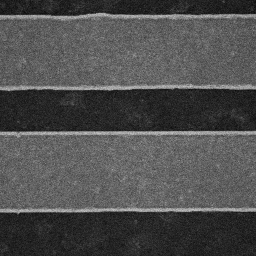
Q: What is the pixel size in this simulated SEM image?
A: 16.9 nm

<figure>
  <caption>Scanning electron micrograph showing one or a few lines or trenches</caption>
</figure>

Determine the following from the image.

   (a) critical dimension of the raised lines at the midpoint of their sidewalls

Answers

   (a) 1.27 microns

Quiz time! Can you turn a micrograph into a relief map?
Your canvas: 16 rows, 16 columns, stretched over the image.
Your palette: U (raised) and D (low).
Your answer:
DDDDDDDDDDDDDDDD
UUUUUUUUUUUUUUUU
UUUUUUUUUUUUUUUU
UUUUUUUUUUUUUUUU
UUUUUUUUUUUUUUUU
UDDDDDUDDDDDDDDD
DDDDDDDDDDDDDDDD
DDDDDDDDDDDDDDDD
UUUUUUUUUUUUUUUU
UUUUUUUUUUUUUUUU
UUUUUUUUUUUUUUUU
UUUUUUUUUUUUUUUU
UUUUUUUUUUUUUUUU
DDDDDDDDDDDDDDDD
DDDDDDDDDDDDDDDD
DDDDDDDDDDDDDDDD